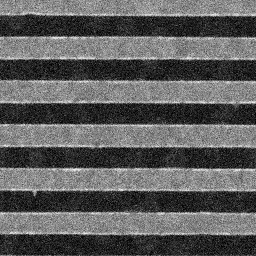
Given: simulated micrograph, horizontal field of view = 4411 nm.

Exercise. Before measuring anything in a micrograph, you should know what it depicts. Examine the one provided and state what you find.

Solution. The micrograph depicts parallel lines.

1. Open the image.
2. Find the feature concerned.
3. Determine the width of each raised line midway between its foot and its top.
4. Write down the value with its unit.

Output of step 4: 368 nanometres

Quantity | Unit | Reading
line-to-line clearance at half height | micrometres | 0.385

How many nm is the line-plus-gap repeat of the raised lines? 755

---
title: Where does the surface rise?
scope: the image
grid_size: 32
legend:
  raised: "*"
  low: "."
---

********************************
********************************
................................
................................
................................
********************************
********************************
................................
................................
................................
********************************
********************************
********************************
................................
................................
................................
********************************
********************************
................................
................................
................................
********************************
********************************
********************************
................................
................................
................*...............
********************************
********************************
................................
................................
................................